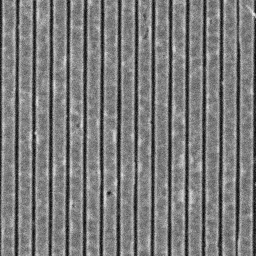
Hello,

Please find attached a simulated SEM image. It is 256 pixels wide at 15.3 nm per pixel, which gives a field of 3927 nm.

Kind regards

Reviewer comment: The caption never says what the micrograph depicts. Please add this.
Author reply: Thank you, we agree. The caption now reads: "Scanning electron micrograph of parallel lines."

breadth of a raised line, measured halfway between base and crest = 184 nanometers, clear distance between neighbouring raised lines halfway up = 4.88 pixels